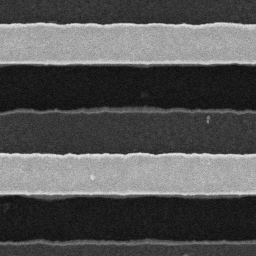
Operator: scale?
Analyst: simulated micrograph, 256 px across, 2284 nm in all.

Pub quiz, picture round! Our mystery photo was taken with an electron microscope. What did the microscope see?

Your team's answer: lines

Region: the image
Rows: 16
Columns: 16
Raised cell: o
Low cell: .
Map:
oooooooooooooooo
oooooooooooooooo
oooooooooooooooo
oooooooooooooooo
................
................
................
oooooooooooooooo
oooooooooooooooo
oooooooooooooooo
oooooooooooooooo
oooooooooooooooo
................
................
................
oooooooooooooooo